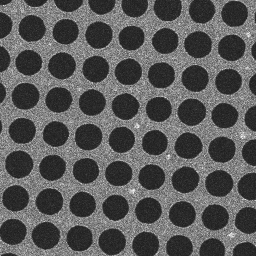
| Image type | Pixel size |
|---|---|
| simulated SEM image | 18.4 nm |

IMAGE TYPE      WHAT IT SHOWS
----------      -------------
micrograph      a regular array of holes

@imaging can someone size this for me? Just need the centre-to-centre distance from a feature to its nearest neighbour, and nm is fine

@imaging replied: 611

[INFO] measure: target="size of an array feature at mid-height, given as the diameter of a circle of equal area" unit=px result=26.7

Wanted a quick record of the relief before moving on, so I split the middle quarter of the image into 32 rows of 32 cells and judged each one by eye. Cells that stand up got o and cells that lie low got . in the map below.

...oo......oo......ooo.....ooooo
...oo......oo......oo.......oo..
..ooo......oo.......o.......oo..
.oooo.....ooo......oo.......o...
ooooooo..ooooo....ooo......oo...
oooooooooooooooooooooo....oooo..
.ooooo..ooooooooooooooooooooooo.
..oo......oooo..oooooooooooooooo
..oo......ooo.....oooo...ooooooo
..oo.......o.......oo.....oooo..
..oo......oo.......oo......oo...
.ooo......oo.......o.......o....
ooooo....oooo.....ooo......o....
oooooooooooooo...oooo.....ooo...
oooooooooooooooooooooooo.oooo...
oooo....ooooooooooooooooooooooo.
.oo......ooo.....ooooooooooooooo
.oo.......oo.....ooo.....oooo...
.oo.......o.......oo......oo....
.oo......oo.......o.......oo....
ooo......ooo.....ooo......o.....
ooooo..ooooo....oooo.....ooo....
ooooooooooooooooooooo...oooo....
oooooooooooooooooooooooooooooo..
ooo.....oooo...ooooooooooooooooo
oo.......oo.....oooo....oooooo.o
oo.......o.......oo......ooo....
oo.......o.......oo......oo.....
ooo.....oo.......oo......oo.....
oooo...oooo.....ooo......oo.....
ooooooooooooo..ooooo....ooo.....
ooooooooooooooooooooo..ooooo....